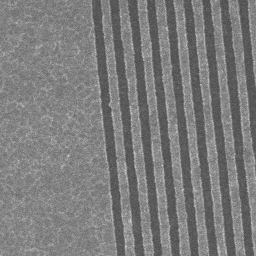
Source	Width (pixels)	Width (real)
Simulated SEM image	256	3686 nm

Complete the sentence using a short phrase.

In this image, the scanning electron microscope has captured parallel lines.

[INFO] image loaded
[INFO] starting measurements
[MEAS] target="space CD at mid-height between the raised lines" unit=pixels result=9.95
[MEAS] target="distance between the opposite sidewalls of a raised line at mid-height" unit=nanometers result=124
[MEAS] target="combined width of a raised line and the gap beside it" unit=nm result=263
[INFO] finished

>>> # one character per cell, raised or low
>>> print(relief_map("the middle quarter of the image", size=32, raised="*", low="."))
********...**..***..**...**..**.
********...**...**..**...**..**.
********...**...**..**...**..**.
*********..**...**..**...**...**
*********..**...**..**...**...**
*********..**...**...**..**...**
*********..**...**...**..**...**
*********..***..**...**..**...**
*********...**..**...**...**..**
*********...**..**...**...**..**
*********...**..***..**...**..**
*********...**...**..**...**..**
*********...**...**..**...**..**
**********..**...**..**...**...*
**********..**...**..**...**...*
**********..***..**...**..**...*
**********...**..**...**..**...*
**********...**..**...**..**...*
**********...**..**...**..***..*
**********...**..**...**...**..*
**********...**..***..**...**..*
**********...**..***..**...**..*
***********..**...**..**...**..*
***********..**...**..***..**...
***********..**...**..***..**...
***********..**...**...**..**...
***********..**...**...**..**...
***********...**..**...**..**...
***********...**..**...**...*...
***********...**..**...**...*...
***********...**...**..**...**..
***********...**...**..**...**..